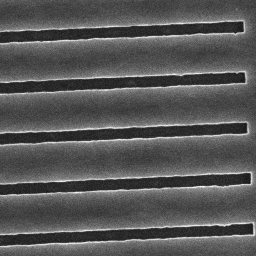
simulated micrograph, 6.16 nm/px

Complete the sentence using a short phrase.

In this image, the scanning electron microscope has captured parallel lines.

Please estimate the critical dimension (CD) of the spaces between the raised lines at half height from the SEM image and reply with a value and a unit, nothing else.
72.3 nanometers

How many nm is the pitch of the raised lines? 312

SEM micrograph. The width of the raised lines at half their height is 0.244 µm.